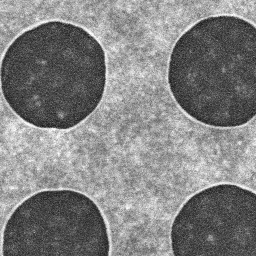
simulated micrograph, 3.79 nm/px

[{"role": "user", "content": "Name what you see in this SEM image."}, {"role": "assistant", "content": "holes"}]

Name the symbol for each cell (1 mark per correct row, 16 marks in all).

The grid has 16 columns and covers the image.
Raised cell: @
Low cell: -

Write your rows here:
@@@@@@@@@@@@@@@@
@@@--@@@@@@@----
@-----@@@@@-----
-------@@@@-----
-------@@@@-----
-------@@@@-----
------@@@@@-----
@----@@@@@@@----
@@@@@@@@@@@@@@@@
@@@@@@@@@@@@@@@@
@@@@@@@@@@@@@@@@
@@@@@@@@@@@@@@@@
@@----@@@@@@----
@-----@@@@@-----
-------@@@@-----
-------@@@@-----